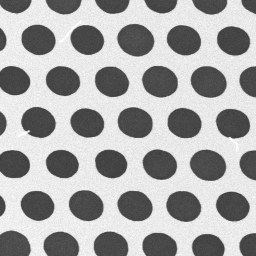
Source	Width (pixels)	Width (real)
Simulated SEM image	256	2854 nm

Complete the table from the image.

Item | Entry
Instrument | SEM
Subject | a regular array of holes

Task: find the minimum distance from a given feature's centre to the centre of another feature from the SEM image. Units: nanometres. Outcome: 534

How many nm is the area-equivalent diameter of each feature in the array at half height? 356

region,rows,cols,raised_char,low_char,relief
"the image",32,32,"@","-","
----@@----@@----@@----@@----@@--
@--@@@@--@@@@--@@@@@-@@@@---@@@-
@@@@@@@@@@@@@@@@@@@@@@@@@@@@@@@@
@@@---@@@@--@@@---@@@@--@@@@--@@
-@@----@@----@@----@@----@@----@
-@@----@@----@@----@@----@@----@
@@@@--@@@@--@@@@---@@@---@@@---@
@@@@@@@@@@@@@@@@@@@@@@@@@@@@@@@@
@--@@@@--@@@@--@@@@--@@@@--@@@@-
---@@@----@@----@@----@@----@@--
----@@----@@----@@----@@----@@--
@--@@@@--@@@@---@@----@@@---@@@-
@@@@@@@@@@@@@@@@@@@@@@@@@@@@@@@@
@@@@-@@@@@@@@@@@-@@@@@@@@@@@@@@@
-@@----@@----@@----@@----@@----@
-@@----@@----@@----@@----@@----@
@@@----@@----@@----@@----@@@---@
@@@@@@@@@@@@@@@@@@@@@@@@@@@@@@@@
@@@@@@@@@@@@@@@@@@@@@@@@@@@@@@@@
---@@@---@@@---@@@----@@----@@--
----@@----@@----@@----@@----@@--
---@@@----@@----@@----@@----@@--
@@@@@@@@@@@@@@@@@@@@@@@@@--@@@@@
@@@@@@@@@@@@@@@@@@@@@@@@@@@@@@@@
@@@---@@@---@@@---@@@---@@@---@@
-@@----@@----@@----@@----@@----@
@@@----@@----@@----@@----@@----@
@@@@-@@@@@--@@@@--@@@@--@@@@--@@
@@@@@@@@@@@@@@@@@@@@@@@@@@@@@@@@
---@@@---@@@---@@@---@@@@--@@@@-
----@@----@@----@@----@@----@@--
----@@----@@----@@----@@----@@--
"